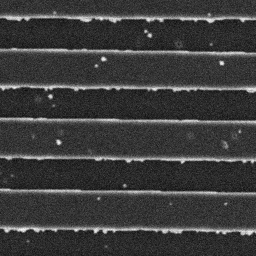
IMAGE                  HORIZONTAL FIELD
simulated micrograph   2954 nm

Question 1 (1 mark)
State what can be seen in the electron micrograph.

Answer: lines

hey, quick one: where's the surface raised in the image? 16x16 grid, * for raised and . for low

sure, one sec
****************
................
................
****************
****************
....************
................
********........
****************
****************
................
................
****************
****************
................
................